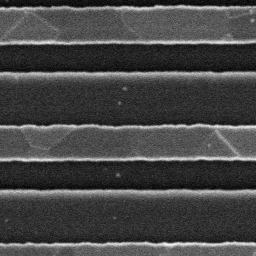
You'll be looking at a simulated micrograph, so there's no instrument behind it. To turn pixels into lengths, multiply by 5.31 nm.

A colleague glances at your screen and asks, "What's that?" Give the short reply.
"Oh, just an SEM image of lines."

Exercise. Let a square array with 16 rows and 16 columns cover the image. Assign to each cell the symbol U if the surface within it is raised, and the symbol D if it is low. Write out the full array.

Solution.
UUUUUUUUUUUUUUUU
UUUUUUUUUUUUUUUU
UUUUUUUUUUUUUUUU
DDDDDDDDDDDDDDDD
DDDDDDDDDDDDDDDD
DDDDDDDDDDDDDDDD
DDDDDDDDDDDDDDDD
DDDDDDDDDDDDDDDD
UUUUUUUUUUUUUUUU
UUUUUUUUUUUUUUUU
DDDDDDDDDDDDDDDD
DDDDDDDDDDDDDDDD
DDDDDDDDDDDDDDDD
DDDDDDDDDDDDDDDD
DDDDDDDDDDDDDDDD
UUUUUUUUUUUUUUUU